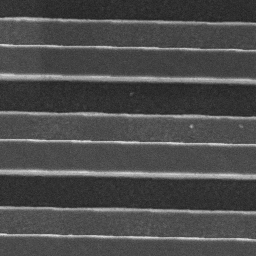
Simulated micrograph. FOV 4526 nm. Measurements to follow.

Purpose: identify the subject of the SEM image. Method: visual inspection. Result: lines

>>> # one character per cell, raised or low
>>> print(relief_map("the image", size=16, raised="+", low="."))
................
++++++++++++++..
++++++++++++++++
++++++++++++++++
++++++++++++++++
................
................
++++++++++++++++
++++++++++++++++
++++++++++++++++
++++++++++++++++
................
................
++++++++++++++++
++++++++++++++++
++++++++++++++++